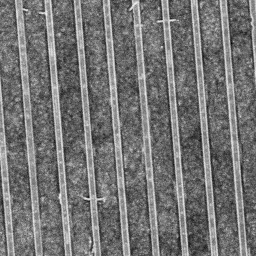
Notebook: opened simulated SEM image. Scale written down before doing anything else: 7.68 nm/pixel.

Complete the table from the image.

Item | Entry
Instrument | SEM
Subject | parallel lines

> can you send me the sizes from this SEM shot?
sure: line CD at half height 42.1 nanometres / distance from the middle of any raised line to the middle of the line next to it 223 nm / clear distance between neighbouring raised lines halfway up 183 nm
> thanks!